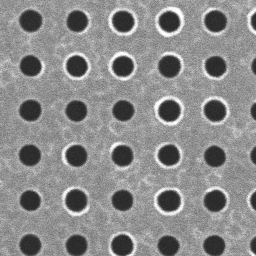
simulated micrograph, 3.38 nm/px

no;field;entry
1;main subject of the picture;a regular array of holes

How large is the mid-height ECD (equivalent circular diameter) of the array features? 70.4 nanometers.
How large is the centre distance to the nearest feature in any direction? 151 nm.